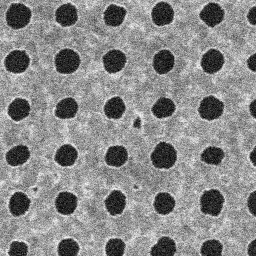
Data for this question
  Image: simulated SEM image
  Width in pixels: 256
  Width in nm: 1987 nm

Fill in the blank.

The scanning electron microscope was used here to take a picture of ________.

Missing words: a regular array of holes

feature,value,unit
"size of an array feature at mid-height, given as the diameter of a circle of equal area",0.19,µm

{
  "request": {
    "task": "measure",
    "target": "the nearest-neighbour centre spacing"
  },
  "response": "360 nm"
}